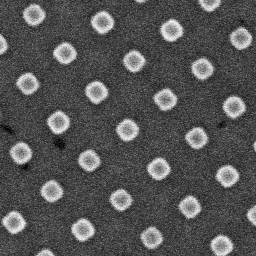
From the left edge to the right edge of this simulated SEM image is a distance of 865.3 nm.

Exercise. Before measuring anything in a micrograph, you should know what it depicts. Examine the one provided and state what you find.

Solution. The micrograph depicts a regular array of raised bodies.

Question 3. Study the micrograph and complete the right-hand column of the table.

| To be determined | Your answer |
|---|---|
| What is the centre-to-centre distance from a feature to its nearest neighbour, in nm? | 164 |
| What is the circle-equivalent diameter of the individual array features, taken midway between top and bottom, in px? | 19.1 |